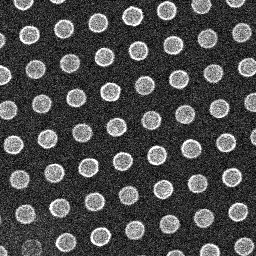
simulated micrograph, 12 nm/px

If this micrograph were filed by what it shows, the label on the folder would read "a regular array of raised bodies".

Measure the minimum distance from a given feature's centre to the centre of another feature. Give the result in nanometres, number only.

418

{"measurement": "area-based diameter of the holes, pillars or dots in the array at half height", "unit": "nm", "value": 225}